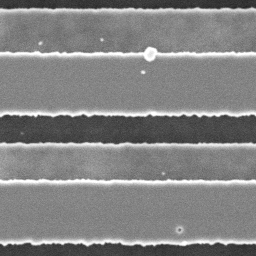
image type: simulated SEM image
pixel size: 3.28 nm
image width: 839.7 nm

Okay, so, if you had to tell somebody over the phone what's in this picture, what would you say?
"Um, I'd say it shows lines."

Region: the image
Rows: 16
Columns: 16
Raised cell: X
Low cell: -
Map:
----------------
XXXXXXXXXXXXXXXX
XXXXXXXXXXXXXXXX
XXXXXXXXXXXXXXXX
XXXXXXXXXXXXXXXX
XXXXXXXXXXXXXXXX
XXXXXXXXXXXXXXXX
----------------
----------------
XXXXXXXXXXXXXXXX
XXXXXXXXXXXXXXXX
XXXXXXXXXXXXXXXX
XXXXXXXXXXXXXXXX
XXXXXXXXXXXXXXXX
XXXXXXXXXXXXXXXX
----------------